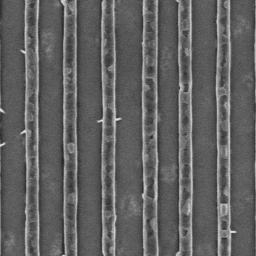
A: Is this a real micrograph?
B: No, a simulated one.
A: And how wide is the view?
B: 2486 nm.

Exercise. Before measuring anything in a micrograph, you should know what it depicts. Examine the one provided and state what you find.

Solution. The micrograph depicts parallel lines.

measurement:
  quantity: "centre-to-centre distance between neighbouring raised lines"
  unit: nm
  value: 372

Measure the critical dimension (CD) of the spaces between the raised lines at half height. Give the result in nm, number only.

255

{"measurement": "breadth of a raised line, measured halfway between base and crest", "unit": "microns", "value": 0.119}